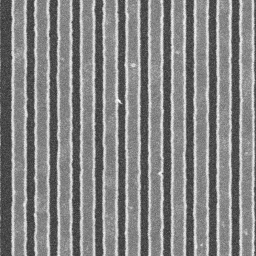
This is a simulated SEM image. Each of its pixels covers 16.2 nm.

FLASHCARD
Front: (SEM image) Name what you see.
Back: parallel lines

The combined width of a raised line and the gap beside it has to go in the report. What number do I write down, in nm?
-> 369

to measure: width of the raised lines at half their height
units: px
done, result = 12.7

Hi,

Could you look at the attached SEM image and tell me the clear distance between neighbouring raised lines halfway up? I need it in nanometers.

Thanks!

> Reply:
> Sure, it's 162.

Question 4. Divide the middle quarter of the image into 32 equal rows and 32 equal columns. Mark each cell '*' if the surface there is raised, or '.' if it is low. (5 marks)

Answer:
**..***...***...***..***...***..
**..***...***...***..***...***..
**..***...***...***..***...***..
**..***...***...***..***...***..
**..***...***...***..***...***..
**..***...***...***..***...***..
**..***...***...***..***...***..
**..***...***...***...**...***..
*...***...***...***...**...***..
*...***...****..***...**...***..
**..***...***...***...**...***..
**..***...***...***...***..***..
**..***...***...***..***...***..
**..***...***...***..***...***..
**..***...***...***..***...***..
**..***...***...***..***...***..
**..***...***...***..***...***..
**..***...***...***..***...***..
**..***...***...***..***...***..
**..***...***...***..***...***..
**..***...***...***..***...***..
**..***...***...***..***...***..
**..****..***...***...**...***..
**..***...***...***..****..***..
**..***...***...***..****..***..
**..***...***...***...***..***..
**..***...***...***...***..***..
**..***...***...***..****..***..
**..***...***...***..****..***..
**..***...***...***...**...***..
**..***...***...***...**...***..
**..***...***...***..****..***..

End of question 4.